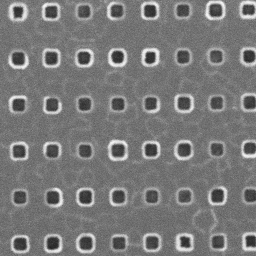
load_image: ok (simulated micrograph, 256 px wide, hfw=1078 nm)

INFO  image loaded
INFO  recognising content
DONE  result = a regular array of holes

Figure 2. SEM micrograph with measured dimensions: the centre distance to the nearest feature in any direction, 137 nanometres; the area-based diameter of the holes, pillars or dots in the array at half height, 0.0606 microns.